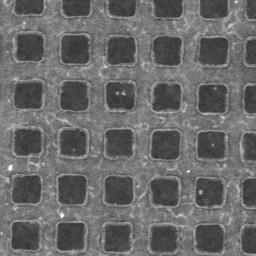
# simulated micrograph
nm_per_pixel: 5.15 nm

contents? a regular array of raised bodies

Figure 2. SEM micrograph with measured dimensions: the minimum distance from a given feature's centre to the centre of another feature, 236 nanometres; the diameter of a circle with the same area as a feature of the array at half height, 175 nm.